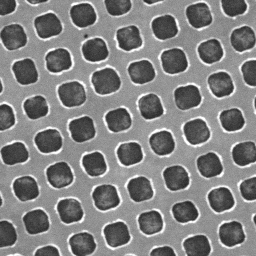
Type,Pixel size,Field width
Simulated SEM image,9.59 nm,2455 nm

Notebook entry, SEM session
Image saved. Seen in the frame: a regular array of holes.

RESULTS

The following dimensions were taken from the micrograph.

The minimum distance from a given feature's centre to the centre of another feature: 338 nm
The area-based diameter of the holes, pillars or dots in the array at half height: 250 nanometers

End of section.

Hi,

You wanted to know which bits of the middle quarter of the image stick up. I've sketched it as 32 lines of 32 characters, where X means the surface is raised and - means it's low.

--XXXXXXXXXXXXXX------XX-------X
-XXXXXXXX----XXX-------XX-----XX
XXXXXXX------XXX-------XXX--XXXX
XXXXXXX-------XXX------XXXXXXXXX
X---XXX-------XXX----XXXXXXXXXXX
-----XX-------XXXXXXXXXXXXXXXX--
-----XXX-----XXXXXXXXXXXXXXX----
-----XXXX--XXXXXXXXXX--XXXXX----
------XXXXXXXXXXXXX-----XXXX----
-----XXXXXXXXXXXXX------XXXX----
----XXXXXXXXXXXXXX-------XXX----
XXXXXXXXXXXX----XXX------XXXX--X
XXXXXXXXXXX-----XXX------XXXXXXX
XXXX---XXX-------XXX---XXXXXXXXX
X------XXXX------XXXXXXXXXXXXXX-
X-------XXX------XXXXXXXXXXXXX--
X-------XXX----XXXXXXXXXXXXXXX--
XX------XXXXXXXXXXXXXX-----XXX--
XX-----XXXXXXXXXXXXXX------XXX--
XXX--XXXXXXXXXXXX-XXX-------XXX-
XXXXXXXXXXXXXX-----XXX------XXXX
XXXXXXXXXXXXX------XXX-----XXXXX
XXXXXX---XXXX-------XXX----XXXXX
XXXXX-----XXX-------XXXXXXXXXXXX
XXXX------XXXX-----XXXXXXXXXXXXX
-XXXX------XXXX-XXXXXXXXXXX--XXX
--XXX------XXXXXXXXXXXXXX------X
--XXXX----XXXXXXXXXXXXXXX------X
--XXXXXXXXXXXXXXX----XXXX------X
--XXXXXXXXXXXXXX------XXX------X
-XXXXXXX----XXXX------XXXX-----X
XXXXXXX------XXX------XXXXX--XXX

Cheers